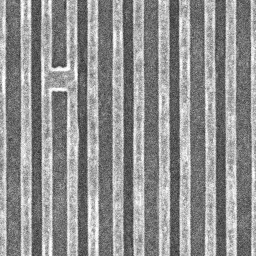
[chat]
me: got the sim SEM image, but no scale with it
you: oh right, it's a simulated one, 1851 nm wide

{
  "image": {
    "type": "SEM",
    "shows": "parallel lines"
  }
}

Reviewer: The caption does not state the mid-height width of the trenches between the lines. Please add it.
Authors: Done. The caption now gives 0.105 µm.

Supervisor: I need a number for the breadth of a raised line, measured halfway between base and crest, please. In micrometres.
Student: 0.0741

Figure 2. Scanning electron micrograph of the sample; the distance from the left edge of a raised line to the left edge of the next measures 164 nm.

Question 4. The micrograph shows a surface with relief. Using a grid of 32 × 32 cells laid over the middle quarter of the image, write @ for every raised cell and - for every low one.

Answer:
-@@---@@----@@@--@@@----@@---@@-
@@@---@@----@@@--@@@----@@---@@-
@@@---@@----@@@--@@@----@@---@@-
@@@---@@----@@@--@@@----@@---@@-
@@@---@@----@@@--@@@----@@---@@-
@@@---@@----@@@--@@@----@@---@@-
@@@---@@----@@@--@@@----@@---@@-
-@@---@@----@@@--@@@----@@---@@-
-@@---@@----@@@---@@----@@---@@-
-@@---@@----@@@---@@----@@---@@-
-@@---@@----@@@---@@----@@---@@-
-@@---@@----@@@---@@----@@---@@-
-@@---@@----@@@---@@----@@---@@-
-@@---@@----@@@---@@----@@---@@-
-@@---@@----@@@---@@----@@---@@-
-@@---@@----@@@---@@----@@---@@-
-@@@--@@----@@@---@@----@@---@@-
-@@@--@@----@@@---@@----@@---@@-
-@@@--@@----@@@---@@----@@---@@-
-@@@--@@----@@@---@@----@@---@@-
-@@---@@----@@@---@@----@@---@@-
-@@---@@----@@@---@@----@@---@@-
-@@---@@----@@@---@@----@@---@@-
-@@---@@@---@@@---@@----@@---@@-
-@@---@@@---@@@---@@----@@---@@-
-@@---@@@---@@@---@@----@@---@@-
-@@---@@@---@@@---@@----@@---@@-
-@@---@@@---@@@---@@----@@---@@-
-@@---@@@---@@@---@@----@@---@@-
-@@---@@@---@@@---@@----@@---@@-
-@@---@@@---@@@---@@----@@---@@-
-@@---@@@---@@@---@@----@@---@@-